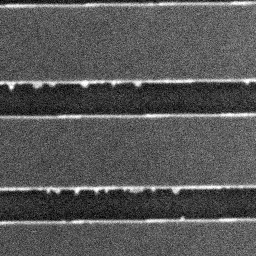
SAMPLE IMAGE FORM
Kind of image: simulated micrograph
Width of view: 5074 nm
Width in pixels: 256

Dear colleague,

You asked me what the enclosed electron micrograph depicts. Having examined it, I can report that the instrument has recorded lines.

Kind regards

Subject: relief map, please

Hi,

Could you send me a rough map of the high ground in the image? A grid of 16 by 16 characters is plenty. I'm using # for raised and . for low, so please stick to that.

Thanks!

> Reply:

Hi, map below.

################
################
################
################
################
................
................
################
################
################
################
################
................
................
################
################